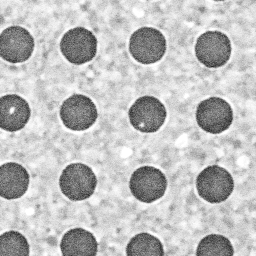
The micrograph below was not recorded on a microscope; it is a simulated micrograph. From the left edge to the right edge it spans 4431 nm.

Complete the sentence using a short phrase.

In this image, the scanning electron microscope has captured a regular array of holes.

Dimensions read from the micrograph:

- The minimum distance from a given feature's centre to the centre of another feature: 1.15 micrometres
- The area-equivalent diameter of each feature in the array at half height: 683 nanometres